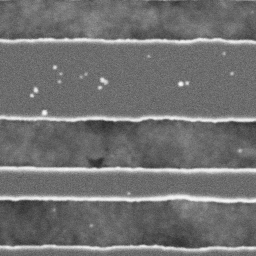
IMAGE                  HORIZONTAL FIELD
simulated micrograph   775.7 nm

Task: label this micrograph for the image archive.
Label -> lines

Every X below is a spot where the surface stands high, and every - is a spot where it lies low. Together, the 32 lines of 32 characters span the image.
--------------------------------
--------------------------------
--------------------------------
--------------------------------
--------------------------------
XXXXXXXXXXXXXXXXXXXXXXXXXXXXXXXX
XXXXXXXXXXXXXXXXXXXXXXXXXXXXXXXX
XXXXXXXXXXXXXXXXXXXXXXXXXXXXXXXX
XXXXXXXXXXXXXXXXXXXXXXXXXXXXXXXX
XXXXXXXXXXXXXXXXXXXXXXXXXXXXXXXX
XXXXXXXXXXXXXXXXXXXXXXXXXXXXXXXX
XXXXXXXXXXXXXXXXXXXXXXXXXXXXXXXX
XXXXXXXXXXXXXXXXXXXXXXXXXXXXXXXX
XXXXXXXXXXXXXXXXXXXXXXXXXXXXXXXX
XXXXXXXXXXXXXXXXXXXXXXXXXXXXXXXX
--------------------------------
--------------------------------
--------------------------------
--------------------------------
--------------------------------
--------------------------------
XXXXXXXXXXXXXXXXXXXXXXXXXXXXXXXX
XXXXXXXXXXXXXXXXXXXXXXXXXXXXXXXX
XXXXXXXXXXXXXXXXXXXXXXXXXXXXXXXX
XXXXXXXXXXXXXXXXXXXXXXXXXXXXXXXX
--------------------------------
--------------------------------
--------------------------------
--------------------------------
--------------------------------
--------------------------------
XXXXXXXXXXXXXXXXXXXXXXXXXXXXXXXX